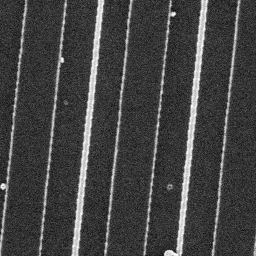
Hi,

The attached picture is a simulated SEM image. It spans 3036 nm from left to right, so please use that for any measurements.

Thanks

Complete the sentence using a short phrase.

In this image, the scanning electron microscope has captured lines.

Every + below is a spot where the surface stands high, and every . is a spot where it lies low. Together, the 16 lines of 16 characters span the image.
..++....+++....+
.+++....+++....+
.+++....++.....+
.+++....++.....+
.+++....++....++
.+++....++....++
.++.....++....++
.++....+++....++
.++....+++....++
.++....+++....++
.++....+++....++
+++....+++....++
+++....++.....++
+++....++.....++
+++....++....+++
+++....++....+++